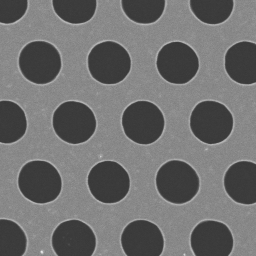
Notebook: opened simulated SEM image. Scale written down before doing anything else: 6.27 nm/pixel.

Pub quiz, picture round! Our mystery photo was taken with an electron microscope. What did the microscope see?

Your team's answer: a regular array of holes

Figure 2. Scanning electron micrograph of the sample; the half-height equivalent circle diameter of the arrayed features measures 42.8 pixels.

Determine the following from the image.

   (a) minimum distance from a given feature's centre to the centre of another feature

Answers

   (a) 430 nanometres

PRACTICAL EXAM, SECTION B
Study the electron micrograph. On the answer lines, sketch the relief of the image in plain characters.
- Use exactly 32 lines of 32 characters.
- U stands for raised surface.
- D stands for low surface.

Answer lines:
DDDUUUUDDDDDUUUDDDDDDUUUDDDDDUUU
DDDUUUUDDDDDUUUUDDDDUUUUDDDDDUUU
DDUUUUUUDDDUUUUUUDDDUUUUUDDDUUUU
UUUUUUUUUUUUUUUUUUUUUUUUUUUUUUUU
UUUUUUUUUUUUUUUUUUUUUUUUUUUUUUUU
UUUUDDUUUUUUDDDUUUUUUDDUUUUUUUDD
UUUDDDDUUUUDDDDDUUUUDDDDUUUUDDDD
UUDDDDDDUUUDDDDDUUUUDDDDDUUUDDDD
UUUDDDDDUUUDDDDDUUUUDDDDDUUUDDDD
UUUDDDDUUUUUDDDDUUUUDDDDUUUUUDDD
UUUUUDUUUUUUUDUUUUUUUUDUUUUUUUUU
UUUUUUUUUUUUUUUUUUUUUUUUUUUUUUUU
UUUUUUUUUUUUUUUUUUUUUUUUUUUUUUUU
DDDUUUUDDDDUUUUUDDDDUUUUDDDDUUUU
DDDUUUUDDDDDUUUDDDDDUUUUDDDDDUUU
DDDUUUUDDDDDUUUDDDDDDUUUDDDDDUUU
DDDUUUUDDDDDUUUUDDDDUUUUDDDDDUUU
DDUUUUUUDDDUUUUUUDDDUUUUUDDDUUUU
UUUUUUUUUUUUUUUUUUUUUUUUUUUUUUUU
UUUUUUUUUUUUUUUUUUUUUUUUUUUUUUUU
UUUDDDUUUUUUDDDUUUUUUDDUUUUUUDDD
UUUDDDDUUUUDDDDDUUUUDDDDUUUUDDDD
UUDDDDDDUUUDDDDDUUUUDDDDDUUUDDDD
UUDDDDDDUUUDDDDDUUUUDDDDDUUUDDDD
UUUDDDDUUUUUDDDDUUUUDDDDUUUUUDDD
UUUUUUUUUUUUUUUUUUUUUUUUUUUUUUUU
UUUUUUUUUUUUUUUUUUUUUUUUUUUUUUUU
DUUUUUUUUUUUUUUUUUUUUUUUUUUUUUUU
DDDUUUUDDDDUUUUUDDDDUUUUDDDDUUUU
DDDUUUUDDDDDUUUDDDDDUUUUDDDDDUUU
DDDUUUUDDDDDUUUDDDDDDUUUDDDDDUUU
DDDUUUUDDDDDUUUUDDDDUUUUDDDDDUUU